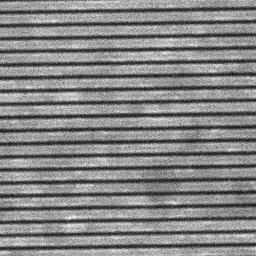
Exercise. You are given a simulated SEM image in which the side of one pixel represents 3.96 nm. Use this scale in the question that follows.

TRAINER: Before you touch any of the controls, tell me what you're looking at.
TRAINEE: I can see parallel lines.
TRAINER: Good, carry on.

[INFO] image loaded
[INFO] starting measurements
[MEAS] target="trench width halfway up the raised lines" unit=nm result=15.8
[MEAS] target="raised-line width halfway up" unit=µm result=0.0356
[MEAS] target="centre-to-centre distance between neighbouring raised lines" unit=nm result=51.9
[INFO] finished